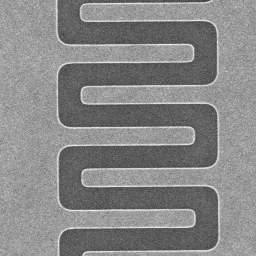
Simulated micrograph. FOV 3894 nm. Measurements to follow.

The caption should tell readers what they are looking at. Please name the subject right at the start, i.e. groups of lines, slits or small figures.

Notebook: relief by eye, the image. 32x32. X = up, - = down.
XXXXXXX--------XXXXXXXXXXXXXXXXX
XXXXXXX---XXXXXXXXXXXXXXXXXXXXXX
XXXXXXX---XXXXXXXXXXXXXXXXXXXXXX
XXXXXXX--------------------XXXXX
XXXXXXX--------------------XXXXX
XXXXXXXXX------------------XXXXX
XXXXXXXXXXXXXXXXXXXXXXXX---XXXXX
XXXXXXXXXXXXXXXXXXXXXXXX---XXXXX
XXXXXXXX-------------------XXXXX
XXXXXXX--------------------XXXXX
XXXXXXX-------------------XXXXXX
XXXXXXX---XXXXXXXXXXXXXXXXXXXXXX
XXXXXXX---XXXXXXXXXXXXXXXXXXXXXX
XXXXXXX--------------------XXXXX
XXXXXXX--------------------XXXXX
XXXXXXXX-------------------XXXXX
XXXXXXXXXXXXXXXXXXXXXXXX---XXXXX
XXXXXXXXXXXXXXXXXXXXXXXX---XXXXX
XXXXXXXX-------------------XXXXX
XXXXXXX--------------------XXXXX
XXXXXXX--------------------XXXXX
XXXXXXX---XXXXXXXXXXXXXXXXXXXXXX
XXXXXXX---XXXXXXXXXXXXXXXXXXXXXX
XXXXXXX-------------------XXXXXX
XXXXXXX--------------------XXXXX
XXXXXXXX-------------------XXXXX
XXXXXXXXXXXXXXXXXXXXXXXX---XXXXX
XXXXXXXXXXXXXXXXXXXXXXXX---XXXXX
XXXXXXXXX------------------XXXXX
XXXXXXXX-------------------XXXXX
XXXXXXX--------------------XXXXX
XXXXXXX----XXXXXXXXXXXXXXXXXXXXX